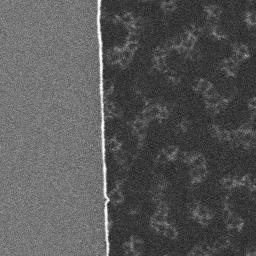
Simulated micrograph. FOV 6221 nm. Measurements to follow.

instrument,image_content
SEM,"one or a few lines or trenches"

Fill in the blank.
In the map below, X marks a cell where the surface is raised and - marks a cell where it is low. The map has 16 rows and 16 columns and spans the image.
------XXXXXXXXXX
------XXXXXXXXXX
------XXXXXXXXXX
------XXXXXXXXXX
------XXXXXXXXXX
------XXXXXXXXXX
------XXXXXXXXXX
------XXXXXXXXXX
------XXXXXXXXXX
------XXXXXXXXXX
-------XXXXXXXXX
-------XXXXXXXXX
-------XXXXXXXXX
-------XXXXXXXXX
-------XXXXXXXXX
-------XXXXXXXXX